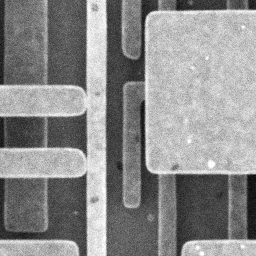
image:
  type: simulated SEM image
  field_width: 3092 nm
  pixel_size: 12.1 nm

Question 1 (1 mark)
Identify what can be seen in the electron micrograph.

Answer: wiring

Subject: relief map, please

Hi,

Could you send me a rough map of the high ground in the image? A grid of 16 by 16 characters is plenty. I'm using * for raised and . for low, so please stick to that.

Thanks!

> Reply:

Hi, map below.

................
.........*******
.........*******
.........*******
.........*******
*****....*******
*****....*******
.........*******
.........*******
*****....*******
*****....*******
................
................
................
................
*****......*****